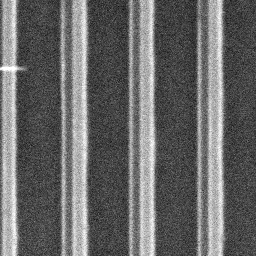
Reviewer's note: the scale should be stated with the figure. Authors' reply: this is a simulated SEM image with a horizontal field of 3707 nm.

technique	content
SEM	lines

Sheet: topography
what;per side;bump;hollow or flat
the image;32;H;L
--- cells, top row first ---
HHLLLLLLHHLLLLLLHHHLLLLLLHHHLLLL
HHLLLLLLHHLLLLLLHHHLLLLLLHHHLLLL
HHLLLLLLHHLLLLLLHHHLLLLLLHHLLLLL
HHLLLLLLHHLLLLLLHHHLLLLLLHHHLLLL
HHLLLLLLHHLLLLLLHHHLLLLLLHHLLLLL
HHLLLLLLHHLLLLLLHHHLLLLLLHHLLLLL
HHLLLLLLHHLLLLLLHHHLLLLLLHHLLLLL
HHLLLLLLHHLLLLLLHHHLLLLLLHHLLLLL
HHLLLLLLHHLLLLLLHHHLLLLLLHHLLLLL
HHLLLLLLHHLLLLLLHHHLLLLLLHHLLLLL
HHLLLLLLHHLLLLLLHHHLLLLLLHHLLLLL
HHLLLLLLHHLLLLLLHHHLLLLLLHHLLLLL
HHLLLLLLHHHLLLLLHHHLLLLLLHHLLLLL
HHLLLLLLHHLLLLLLHHHLLLLLLHHLLLLL
HHLLLLLLHHHLLLLLHHHLLLLLLHHLLLLL
HHLLLLLLHHLLLLLLHHHLLLLLLHHLLLLL
HHLLLLLLHHLLLLLLHHHLLLLLLHHLLLLL
HHLLLLLLHHLLLLLLHHHLLLLLLHHHLLLL
HHLLLLLLHHHLLLLLHHHLLLLLLHHHLLLL
HHLLLLLLHHLLLLLLHHHLLLLLLHHLLLLL
HHLLLLLLHHLLLLLLHHHLLLLLLHHLLLLL
HHLLLLLLHHLLLLLLHHHLLLLLLHHHLLLL
HHLLLLLLHHLLLLLLHHHLLLLLLHHLLLLL
HHLLLLLLHHHLLLLLHHHLLLLLLHHLLLLL
HHLLLLLLHHLLLLLLHHHLLLLLLHHLLLLL
HHLLLLLLHHLLLLLLHHHLLLLLLHHHLLLL
HHLLLLLLHHLLLLLLHHHLLLLLLHHHLLLL
HHLLLLLLHHLLLLLLHHHLLLLLLHHHLLLL
HHLLLLLLHHHLLLLLHHHLLLLLLHHHLLLL
HHLLLLLLHHLLLLLLHHHLLLLLLHHHLLLL
HHLLLLLLHHLLLLLLHHHLLLLLLHHHLLLL
HHLLLLLLHHHLLLLLHHHLLLLLLHHHLLLL